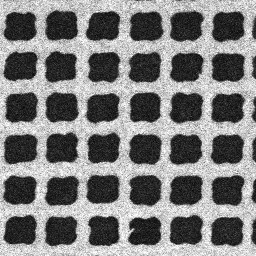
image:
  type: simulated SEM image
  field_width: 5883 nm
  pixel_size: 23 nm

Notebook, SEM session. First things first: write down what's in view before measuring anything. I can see a regular array of holes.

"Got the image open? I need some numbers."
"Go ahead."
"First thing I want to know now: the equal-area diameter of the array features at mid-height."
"32.4 pixels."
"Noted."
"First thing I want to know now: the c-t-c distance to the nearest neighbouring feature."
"929 nm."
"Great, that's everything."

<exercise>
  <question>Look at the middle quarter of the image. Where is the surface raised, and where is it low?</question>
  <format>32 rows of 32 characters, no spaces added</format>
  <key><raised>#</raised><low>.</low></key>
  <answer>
...###........###.......###.....
...###........###.......###.....
...###........##........###.....
...###.......###.......####.....
#######..##.######....##########
################################
################################
..#########..#####.....#####....
...####.......###.......###.....
...###........##........###.....
...###........###.......###.....
...###........###.......###.....
....##........###.......##......
...###.......####.......###.....
#.#####..############.######..##
################################
################################
#.#########..###############.###
...####.......###.......###.....
...###........###.......###.....
...###........###.......###.....
...###........###.......###.....
...###........##........###.....
...###.......###........##......
..#####......####......####.....
################################
################################
################################
...####.......###......#####....
....##........##........###.....
....##........###.......###.....
....##........###.......###.....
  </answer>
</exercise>